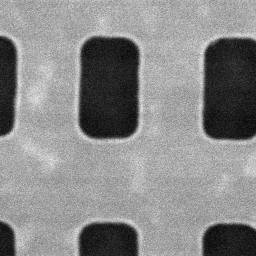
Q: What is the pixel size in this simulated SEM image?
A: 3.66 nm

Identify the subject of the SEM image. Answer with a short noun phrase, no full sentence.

holes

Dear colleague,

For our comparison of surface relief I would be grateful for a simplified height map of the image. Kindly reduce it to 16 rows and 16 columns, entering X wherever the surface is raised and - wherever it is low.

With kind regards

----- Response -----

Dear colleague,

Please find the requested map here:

XXXXXXXXXXXXXXXX
XXXXXXXXXXXXXXXX
-XXXX---XXXXX---
-XXXX----XXXX---
-XXXX----XXXX---
-XXXX----XXXX---
-XXXX----XXXX---
-XXXX----XXXX---
XXXXX---XXXXX---
XXXXXXXXXXXXXXXX
XXXXXXXXXXXXXXXX
XXXXXXXXXXXXXXXX
XXXXXXXXXXXXXXXX
XXXXXXXXXXXXXXXX
-XXXX----XXXX---
-XXXX----XXXX---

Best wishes